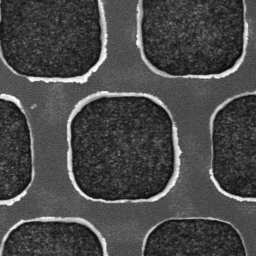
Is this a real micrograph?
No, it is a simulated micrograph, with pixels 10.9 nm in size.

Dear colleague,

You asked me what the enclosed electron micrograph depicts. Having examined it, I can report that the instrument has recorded holes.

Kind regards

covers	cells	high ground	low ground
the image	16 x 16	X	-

------XXX------X
------XXX------X
------XXX------X
------XXX------X
X----XXXXX----XX
XXXXXXXXXXXXXXXX
-XXXX-----XXXX--
--XXX------XX---
--XX-------XX---
--XX-------XX---
--XXX------XX---
--XXX------XXX--
XXXXXX---XXXXXXX
XXXXXXXXXXXXXXXX
X-----XXX------X
------XXX------X